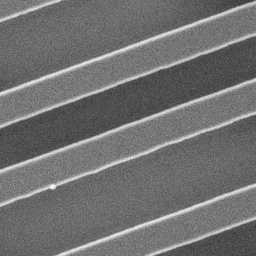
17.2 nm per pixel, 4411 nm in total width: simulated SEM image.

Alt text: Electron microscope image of lines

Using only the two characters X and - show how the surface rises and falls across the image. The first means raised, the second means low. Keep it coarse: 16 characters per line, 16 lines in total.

XX-------------X
------------XXXX
---------XXXXXX-
------XXXXXX----
----XXXXXX------
-XXXXXX-------XX
XXXX--------XXXX
X--------XXXXXX-
------XXXXXX----
---XXXXXX-------
XXXXXXX---------
XXXX------------
X------------XXX
----------XXXXXX
--------XXXXXX--
-----XXXXXX-----